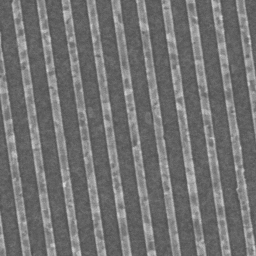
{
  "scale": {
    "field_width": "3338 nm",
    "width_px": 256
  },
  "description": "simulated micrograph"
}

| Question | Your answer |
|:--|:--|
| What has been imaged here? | parallel lines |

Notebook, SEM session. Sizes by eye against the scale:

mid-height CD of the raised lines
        93.6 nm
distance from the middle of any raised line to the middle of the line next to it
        322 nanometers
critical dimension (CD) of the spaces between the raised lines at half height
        224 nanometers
